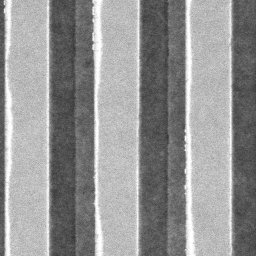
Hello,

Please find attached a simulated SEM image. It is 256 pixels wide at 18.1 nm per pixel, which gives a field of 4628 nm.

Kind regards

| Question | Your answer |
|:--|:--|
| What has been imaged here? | lines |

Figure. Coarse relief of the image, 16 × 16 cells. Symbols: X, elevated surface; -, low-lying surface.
XXX---XXX---XX--
XXX---XXX---XX--
XXX---XXX---XX--
XXX---XXX---XX--
XXX---XXX---XX--
XXX---XXX---XX--
XXX---XXX---XX--
XXX---XXX---XX--
XXX---XXX---XX--
XXX---XXX---XX--
XXX---XXX---XX--
XXX---XXX---XX--
XXX---XXX---XX--
XXX---XXX---XX--
XXX---XXX---XX--
XXX---XXX---XX--